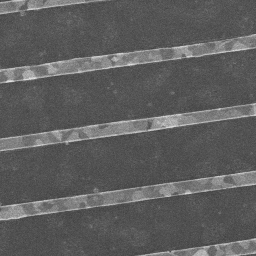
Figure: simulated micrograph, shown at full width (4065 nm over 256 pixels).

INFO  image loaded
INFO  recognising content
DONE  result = one or a few lines or trenches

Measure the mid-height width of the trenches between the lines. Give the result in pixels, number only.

55.6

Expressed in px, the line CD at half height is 12.1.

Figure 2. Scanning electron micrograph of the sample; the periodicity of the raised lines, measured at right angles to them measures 67.6 px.